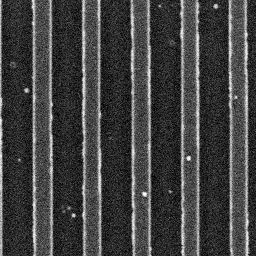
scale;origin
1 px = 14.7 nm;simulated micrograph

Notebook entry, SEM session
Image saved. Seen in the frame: lines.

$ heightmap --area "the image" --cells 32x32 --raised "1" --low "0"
00001100001100001110000110000110
00001100001100001110000110000110
00001100001100001110000110000110
00001100001100001110000110000110
00001100001100001110000110000110
00001100001100000110000110000110
00001100001100001110000110000110
00001100001100001110000110000110
00001100001100001110000110000110
00001100001100000110000110000110
00001100001100000110000110000110
00001100001100000110000110000110
00001100001100000110000110000110
00001100001100000110000110000110
00001100001100000110000110000110
00001100001100000110000110000110
00001100001100000110000110000110
00001100001100000110000110000110
00001100001100000110000110000110
00001100001110000110000110000110
00001100000110000110000110000110
00001100000110000110000110000110
00001100000110000110000110000110
00001100001110000110000110000110
00001100001110000110000110000110
00001100000110000110000110000110
00001100001110000110000110000110
00001100000110000110000110000110
00001100000110000110000110000110
00001100000110000110000110000110
00001100000110000110000110000110
00001100000110000110000110000110